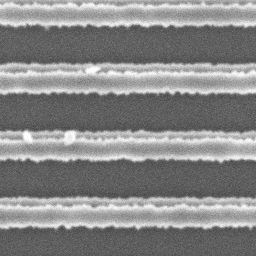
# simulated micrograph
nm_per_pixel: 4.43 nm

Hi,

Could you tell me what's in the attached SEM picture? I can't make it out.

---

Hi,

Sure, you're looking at lines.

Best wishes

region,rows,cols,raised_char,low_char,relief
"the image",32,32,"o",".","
oooooooooooooooooooooooooooooooo
oooooooooooooooooooooooooooooooo
oooooooooooooooooooooooooooooooo
................................
................................
................................
................................
................................
oooooooooooooooooooooooooooooooo
oooooooooooooooooooooooooooooooo
oooooooooooooooooooooooooooooooo
o.ooooooooo.oooo.ooo.o.ooooooooo
................................
................................
................................
................................
...o.o.o.o.......o.......o......
oooooooooooooooooooooooooooooooo
oooooooooooooooooooooooooooooooo
oooooooooooooooooooooooooooooooo
................................
................................
................................
................................
................................
oooooooooooooooooooooooooooooooo
oooooooooooooooooooooooooooooooo
oooooooooooooooooooooooooooooooo
................................
................................
................................
................................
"